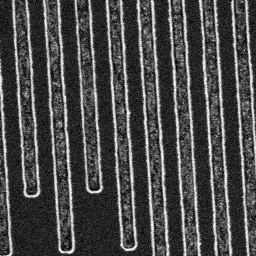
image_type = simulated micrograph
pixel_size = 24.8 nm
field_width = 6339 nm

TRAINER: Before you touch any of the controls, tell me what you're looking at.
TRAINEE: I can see parallel lines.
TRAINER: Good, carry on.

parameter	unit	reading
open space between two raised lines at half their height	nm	327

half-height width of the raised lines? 445 nanometres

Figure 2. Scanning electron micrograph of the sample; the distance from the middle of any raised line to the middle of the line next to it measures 774 nm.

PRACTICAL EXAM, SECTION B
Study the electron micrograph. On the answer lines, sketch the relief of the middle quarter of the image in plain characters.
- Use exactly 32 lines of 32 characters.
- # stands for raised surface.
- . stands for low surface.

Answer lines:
####...#####...#####...#####...#
####...#####...#####...#####...#
####...#####...#####...#####...#
####....####...#####...#####...#
####....####...#####...#####...#
####....####....####...#####...#
####....####....####...#####...#
####....####....####...#####...#
#####...####....####....####...#
####....####....####....####...#
####....####....####....####...#
#####...####....####....####....
#####...#####...####....####....
#####...#####...####....####....
#####...#####...####....####....
#####...#####...####....####....
.####...#####...####....####....
.####...#####...#####...####....
.####...#####...#####...####....
.####....####...#####...#####...
.####....####...#####...#####...
.####....####....####...#####...
.####....####....####...#####...
.####....####....####...#####...
.####....####....####....####...
.####....####....####....####...
.####....####....####....####...
.#####...####....####....####...
.#####...####....####....####...
.#####...####....####....####...
.#####...#####...####....####...
.#####...#####...####....####...